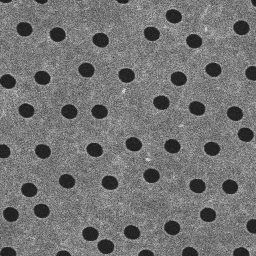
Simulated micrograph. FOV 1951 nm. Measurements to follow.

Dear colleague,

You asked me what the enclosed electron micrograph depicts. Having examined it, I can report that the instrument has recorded a regular array of holes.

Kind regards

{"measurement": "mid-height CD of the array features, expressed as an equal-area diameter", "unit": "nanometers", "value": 117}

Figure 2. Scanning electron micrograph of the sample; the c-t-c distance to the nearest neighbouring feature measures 33.3 pixels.